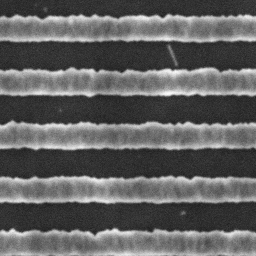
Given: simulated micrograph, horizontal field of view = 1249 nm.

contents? lines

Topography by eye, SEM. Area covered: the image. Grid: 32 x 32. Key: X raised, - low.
--------------------------------
--------------------------------
XXXXXXXXXXXXXXXXXXXXXXXXXXXXXXXX
XXXXXXXXXXXXXXXXXXXXXXXXXXXXXXXX
XXXXXXXXXXXXXXXXXXXXXXXXXXXXXXXX
--------------------------------
--------------------------------
--------------------------------
--------------------------------
XXXXXXXXXXXXXXXXXXXXXXXXXXXXXXXX
XXXXXXXXXXXXXXXXXXXXXXXXXXXXXXXX
XXXXXXXXXXXXXXXXXXXXXXXXXXXXXXXX
--------------------------------
--------------------------------
--------------------------------
-XXX------XX------XX---X------XX
XXXXXXXXXXXXXXXXXXXXXXXXXXXXXXXX
XXXXXXXXXXXXXXXXXXXXXXXXXXXXXXXX
XXX-XXXXXXXXXXXXXXXXXXXXXXXXXXXX
--------------------------------
--------------------------------
--------------------------------
XXXXXXXXXXXXXXXXXXXXXXXXXXXXXXXX
XXXXXXXXXXXXXXXXXXXXXXXXXXXXXXXX
XXXXXXXXXXXXXXXXXXXXXXXXXXXXXXXX
--------------------------------
--------------------------------
--------------------------------
--------------------------------
XXXXXXXXXXXXXXXXXXXXXXXXXXXXXXXX
XXXXXXXXXXXXXXXXXXXXXXXXXXXXXXXX
XXXXXXXXXXXXXXXXXXXXXXXXXXXXXXXX